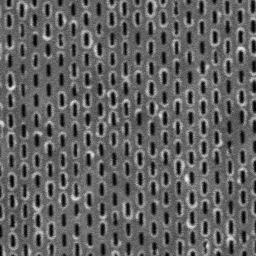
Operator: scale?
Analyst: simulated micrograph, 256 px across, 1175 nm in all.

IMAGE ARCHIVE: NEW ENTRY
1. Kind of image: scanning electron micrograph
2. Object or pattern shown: a regular array of holes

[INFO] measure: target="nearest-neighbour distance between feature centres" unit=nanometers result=73.2